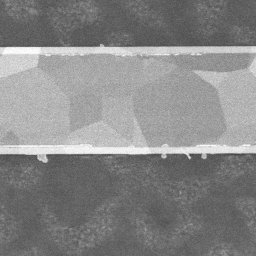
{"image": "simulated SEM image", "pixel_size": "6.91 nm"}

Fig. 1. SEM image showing one or a few lines or trenches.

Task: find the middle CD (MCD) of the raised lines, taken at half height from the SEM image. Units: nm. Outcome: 706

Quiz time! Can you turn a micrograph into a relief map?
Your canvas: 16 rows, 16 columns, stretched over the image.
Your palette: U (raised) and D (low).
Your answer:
DDDDDDDDDDDDDDDD
DDDDDDDDDDDDDDDD
DDDDDDDDDDDDDDDD
UUUUUUUUUUUUUUUU
UUUUUUUUUUUUUUUU
UUUUUUUUUUUUUUUU
UUUUUUUUUUUUUUUU
UUUUUUUUUUUUUUUU
UUUUUUUUUUUUUUUU
DDDDDDDDDDDUDDDD
DDDDDDDDDDDDDDDD
DDDDDDDDDDDDDDDD
DDDDDDDDDDDDDDDD
DDDDDDDDDDDDDDDD
DDDDDDDDDDDDDDDD
DDDDDDDDDDDDDDDD